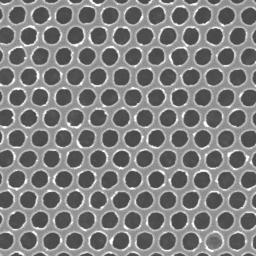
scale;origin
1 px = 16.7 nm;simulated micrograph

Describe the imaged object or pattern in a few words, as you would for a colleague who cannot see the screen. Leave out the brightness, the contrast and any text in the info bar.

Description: a regular array of holes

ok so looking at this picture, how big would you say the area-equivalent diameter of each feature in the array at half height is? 283 nanometres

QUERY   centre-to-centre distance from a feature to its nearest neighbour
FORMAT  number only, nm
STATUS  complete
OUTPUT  380